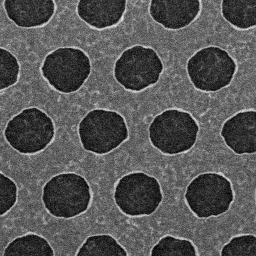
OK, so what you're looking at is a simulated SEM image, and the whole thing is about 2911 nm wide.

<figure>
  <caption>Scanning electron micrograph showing a regular array of holes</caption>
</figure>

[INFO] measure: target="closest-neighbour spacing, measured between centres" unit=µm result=0.812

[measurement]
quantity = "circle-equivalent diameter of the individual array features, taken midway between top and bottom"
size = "524 nm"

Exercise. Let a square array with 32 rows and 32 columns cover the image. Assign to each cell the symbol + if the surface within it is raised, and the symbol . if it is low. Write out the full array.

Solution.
+......+++......+++......+++....
+......+++.....++++......+++....
+.....++++.....++++.....++++....
++++++++++++.++++++++.++++++++.+
++++++++++++++++++++++++++++++++
++++++++++++++++++++++++++++++++
.++++++...++++++...++++++...++++
..++++.....++++.....++++.....+++
..+++......+++......+++.......++
..+++......+++......++++.....+++
..++++....+++++....+++++.....+++
++++++++.+++++++++++++++++++++++
++++++++++++++++++++++++++++++++
++++++++++++++++++++++++++++++++
++....+++++....+++++....+++++...
+......+++......+++......+++....
+......+++......+++......+++....
+.....++++......+++.....++++....
++...++++++...++++++....+++++...
++++++++++++++++++++++++++++++++
++++++++++++++++++++++++++++++++
++++++++++++++++++++++++++++++++
.+++++.....++++....+++++....++++
..+++......+++......+++......+++
..+++......+++......+++......+++
..++++.....++++.....+++......+++
.+++++....+++++....+++++....++++
++++++++++++++++++++++++++++++++
++++++++++++++++++++++++++++++++
+++..+++++++..++++++++++++++++..
+.....++++.....+++++....++++....
+......+++......+++......+++....